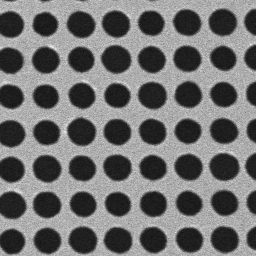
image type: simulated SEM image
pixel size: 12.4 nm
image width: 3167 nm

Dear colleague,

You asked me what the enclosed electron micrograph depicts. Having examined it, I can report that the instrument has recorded a regular array of holes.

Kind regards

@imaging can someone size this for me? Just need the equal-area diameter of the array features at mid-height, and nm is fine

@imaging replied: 338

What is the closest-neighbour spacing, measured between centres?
436 nm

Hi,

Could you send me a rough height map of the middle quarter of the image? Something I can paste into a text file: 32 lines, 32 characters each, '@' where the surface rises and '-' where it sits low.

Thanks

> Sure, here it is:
@------@@@-------@@------@@@----
@@----@@@@@-----@@@@----@@@@@---
@@@@@@@@@@@@@@@@@@@@@@@@@@@@@@@@
@@@@@@@@@@@@@@@@@@@@@@@@@@@@@@@@
@@@@@@@@@@@@@@@@@@@@@--@@@@@@@--
@@-----@@@@----@@@@------@@@----
@------@@@------@@@------@@@----
@-------@@-------@--------@@----
@-------@@-------@@-------@@----
@@------@@------@@@------@@@----
@@-----@@@@----@@@@@-----@@@@---
@@@@@@@@@@@@@@@@@@@@@@@@@@@@@@@@
@@@@@@@@@@@@@@@@@@@@@@@@@@@@@@@@
@@@--@@@@@@@@@@@@@@@@@@@@@@@@@@@
@@-----@@@@----@@@@@----@@@@@---
@-------@@------@@@------@@@----
@-------@@-------@@------@@-----
@-------@@-------@@-------@@----
@-------@@------@@@------@@@----
@@-----@@@@-----@@@@-----@@@@---
@@@-@@@@@@@@@@@@@@@@@@@@@@@@@@@@
@@@@@@@@@@@@@@@@@@@@@@@@@@@@@@@@
@@@@@@@@@@@@@@@@@@@@@@@@@@@@@@--
@@-----@@@@-----@@@@-----@@@----
@-------@@-------@@------@@@----
@-------@@-------@@-------@-----
@-------@@-------@@-------@@----
@-------@@-------@@-------@@----
@@-----@@@@-----@@@@-----@@@@---
@@@@@@@@@@@@@@@@@@@@@@@@@@@@@@@@
@@@@@@@@@@@@@@@@@@@@@@@@@@@@@@@@
@@@@@@@@@@@@@@@@@@@@@@@@@@@@@@-@